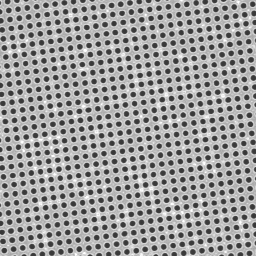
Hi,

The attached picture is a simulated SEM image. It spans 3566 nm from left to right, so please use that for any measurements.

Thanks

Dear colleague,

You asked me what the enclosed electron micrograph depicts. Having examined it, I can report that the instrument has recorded a regular array of holes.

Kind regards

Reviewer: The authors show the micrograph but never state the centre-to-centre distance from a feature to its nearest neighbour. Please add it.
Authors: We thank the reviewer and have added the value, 8.89 pixels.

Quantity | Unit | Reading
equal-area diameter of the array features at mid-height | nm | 81.7